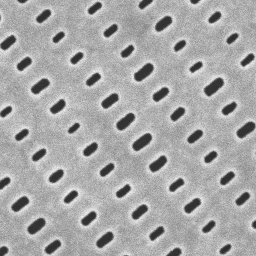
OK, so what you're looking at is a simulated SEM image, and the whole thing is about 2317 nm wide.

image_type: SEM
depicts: a regular array of holes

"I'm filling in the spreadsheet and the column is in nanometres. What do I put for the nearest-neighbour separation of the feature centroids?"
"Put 240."